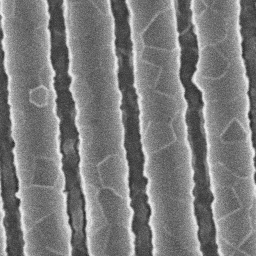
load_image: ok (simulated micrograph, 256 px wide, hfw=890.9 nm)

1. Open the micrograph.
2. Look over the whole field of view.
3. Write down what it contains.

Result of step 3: parallel lines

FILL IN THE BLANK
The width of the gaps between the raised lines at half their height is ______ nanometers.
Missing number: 61.4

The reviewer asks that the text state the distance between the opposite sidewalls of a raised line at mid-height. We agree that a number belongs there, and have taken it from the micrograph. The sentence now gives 160 nm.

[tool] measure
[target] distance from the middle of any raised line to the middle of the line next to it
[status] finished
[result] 222 nanometres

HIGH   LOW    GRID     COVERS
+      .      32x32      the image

++++++..++++++..++++++..++++++..
++++++..++++++..++++++..++++++..
++++++..++++++..++++++..++++++..
++++++..++++++..++++++..++++++..
++++++..++++++..++++++...+++++..
++++++..++++++...+++++...+++++..
.+++++...+++++...++++++..+++++..
.+++++...++++++..+++++...+++++..
.++++++..++++++..+++++...++++++.
.++++++..++++++..+++++..+++++++.
.++++++..++++++..++++++..++++++.
.++++++..++++++..++++++..++++++.
.++++++..++++++..++++++..++++++.
.++++++...+++++..++++++...+++++.
.++++++...+++++..++++++...+++++.
..+++++...+++++...+++++...+++++.
.++++++...+++++...+++++...+++++.
..+++++...+++++...+++++...+++++.
..+++++...++++++..++++++..++++++
..++++++..++++++..++++++..++++++
..++++++..++++++..++++++..++++++
..++++++..++++++..++++++..++++++
..++++++..++++++...+++++..++++++
..++++++..++++++..++++++..++++++
..++++++...+++++...+++++...+++++
..++++++...+++++...+++++...+++++
...+++++...++++++..+++++...+++++
...+++++...+++++...+++++...+++++
+..++++++..+++++...++++++..+++++
+..++++++..++++++..++++++..+++++
+..++++++..++++++..++++++..+++++
+..++++++..++++++..++++++..+++++